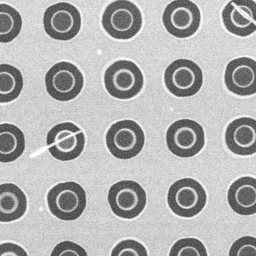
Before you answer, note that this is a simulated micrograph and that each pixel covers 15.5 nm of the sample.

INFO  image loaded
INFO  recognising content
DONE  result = an array of small figures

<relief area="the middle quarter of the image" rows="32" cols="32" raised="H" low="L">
LLLHHHHHHHHLLLLLLLLHHHHHHHLLLLLL
LLLLHHHHHHLLLLLLLLLHHHHHHLLLHHHH
HHLLLHHHHHLLLHHHHLLLHHHHHLLLHHHH
HHLLLHHHHLLLLHHHHLLLHHHHHLLLHHHH
HHHLLHHHHHLLLHHHHLLLHHHHHLLLHHHH
HHLLLHHHHHLLLHHHHLLLHHHHHLLLHHHL
HLLLLHHHHHLLLLLLLLLLHHHHHLLLLLLL
LLLLHHHHHHHLLLLLLLLHHHHHHHLLLLLL
LLLHHHHHHHHHHLLLLLHHHHHHHHHHHHHH
LHHHHHHHHHHHHHHHHHHHHHHHHHHHHHHH
HHHHHHHHHHHHHHHHHHHHHHHHHHHHHHHH
HHHHHHHHHHHHHHHHHHHHHHHHHHHHHHHH
HHHHHHHHHHHHHHHHHHHHHHHHHHHHHHHH
HHHHHHHHHHHHHHHHHHHHHHHHHHHHHHLH
LLHHHHHHHHHHLLLLLLHHHHHHHHHLLLLL
LLLLHHHHHHHLLLLLLLLHHHHHHHLLLLLL
LLLLLHHHHHHLLLLHLLLLHHHHHHLLLHHL
HHHLLHHHHHLLLHHHHLLLHHHHHLLLHHHH
HHHLLLHHHHLLLHHHHLLLHHHHHLLLHHHH
HHHLLLHHHHLLLHHHHLLLHHHHHLLLHHHH
HHLLLHHHHHLLLHHHHLLLHHHHHHLLLHHH
LLLLLHHHHHHLLLLLLLLHHHHHHHLLLLLL
LLLLHHHHHHHHLLLLLLLHHHHHHHHLLLLL
LLLHHHHHHHHHHLLLLHHHHHHHHHHHHLHH
HHHHHHHHHHHHHHHHHHHHHHHHHHHHHHHH
HHHHHHHHHHHHHHHHHHHHHHHHHHHHHHHH
HHHHHHHHHHHHHHHHHHHHHHHHHHHHHHHH
HHHHHHHHHHHHHHHHHHHHHHHHHHHHHHHH
HHHHHHHHHHHHHHHHHHHHHHHHHHHHHHLL
LLLHHHHHHHHHHLLLLLHHHHHHHHHHLLLL
LLLLHHHHHHHHLLLLLLLHHHHHHHHLLLLL
LLLLLHHHHHHLLLLLLLLLHHHHHHLLLHHH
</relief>